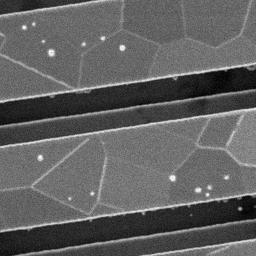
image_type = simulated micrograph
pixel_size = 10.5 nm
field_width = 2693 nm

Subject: lines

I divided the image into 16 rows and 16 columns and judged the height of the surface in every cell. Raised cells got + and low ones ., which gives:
...+++++++++++++
++++++++++++++++
++++++++++++++++
++++++++++++++++
+++++++++++++...
++++++..........
................
...........+++++
....++++++++++++
++++++++++++++++
++++++++++++++++
++++++++++++++++
++++++++++++++..
+++++++.........
................
............++++